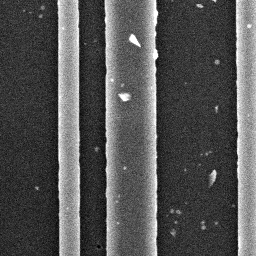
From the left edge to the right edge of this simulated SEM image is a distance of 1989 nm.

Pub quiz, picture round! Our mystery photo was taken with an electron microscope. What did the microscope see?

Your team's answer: lines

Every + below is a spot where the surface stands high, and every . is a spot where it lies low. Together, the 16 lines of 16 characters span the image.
....++++++.....+
....++++++.....+
....++++++.....+
....++++++.....+
....++++++.....+
....++++++.....+
....++++++.....+
....++++++.....+
....++++++.....+
....++++++.....+
....++++++.....+
....++++++.....+
....++++++.....+
....++++++.....+
....++++++.....+
....++++++.....+